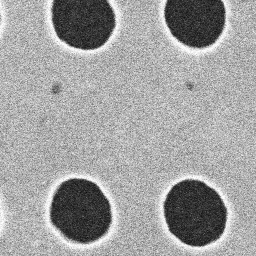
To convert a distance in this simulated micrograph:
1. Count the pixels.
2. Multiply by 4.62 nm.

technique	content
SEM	holes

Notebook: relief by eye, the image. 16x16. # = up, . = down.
###....###....##
###....###....##
####...####...##
################
################
################
################
################
################
################
################
####..#####..###
###....###....##
###....###....##
####...####...##
################